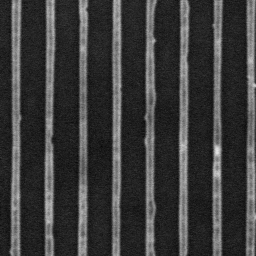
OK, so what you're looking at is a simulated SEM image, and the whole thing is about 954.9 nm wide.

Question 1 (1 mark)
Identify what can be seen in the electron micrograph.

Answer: parallel lines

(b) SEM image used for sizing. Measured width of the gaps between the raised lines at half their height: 101 nanometres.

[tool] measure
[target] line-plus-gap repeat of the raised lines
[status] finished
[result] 125 nanometres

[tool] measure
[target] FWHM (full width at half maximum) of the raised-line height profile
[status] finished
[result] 25.2 nm